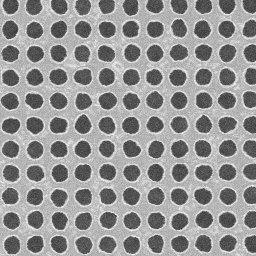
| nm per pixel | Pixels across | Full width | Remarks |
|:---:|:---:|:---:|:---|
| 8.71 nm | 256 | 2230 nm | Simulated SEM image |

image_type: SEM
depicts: a regular array of holes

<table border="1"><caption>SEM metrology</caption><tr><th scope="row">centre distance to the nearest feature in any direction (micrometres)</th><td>0.204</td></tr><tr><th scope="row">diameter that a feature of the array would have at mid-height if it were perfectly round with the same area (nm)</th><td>152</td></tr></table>